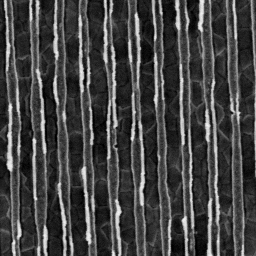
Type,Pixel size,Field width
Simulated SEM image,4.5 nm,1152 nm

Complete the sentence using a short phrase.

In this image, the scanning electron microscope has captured parallel lines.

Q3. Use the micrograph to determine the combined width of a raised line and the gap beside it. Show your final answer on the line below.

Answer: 111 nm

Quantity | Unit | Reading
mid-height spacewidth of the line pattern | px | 15.1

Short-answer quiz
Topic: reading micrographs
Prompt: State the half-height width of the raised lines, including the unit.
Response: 0.0416 µm